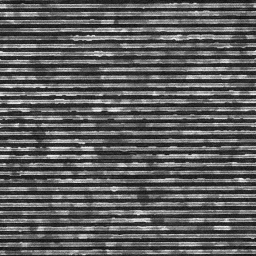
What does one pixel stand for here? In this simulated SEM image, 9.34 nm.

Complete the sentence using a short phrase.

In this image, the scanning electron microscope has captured parallel lines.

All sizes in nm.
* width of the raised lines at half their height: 30.4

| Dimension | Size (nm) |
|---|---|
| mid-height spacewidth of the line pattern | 44.4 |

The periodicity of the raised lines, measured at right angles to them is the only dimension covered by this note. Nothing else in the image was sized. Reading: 74.3 nanometers